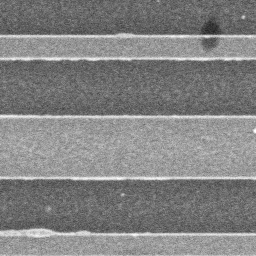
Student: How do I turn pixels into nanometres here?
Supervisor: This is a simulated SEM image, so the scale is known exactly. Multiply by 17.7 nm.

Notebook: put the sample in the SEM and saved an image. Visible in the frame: lines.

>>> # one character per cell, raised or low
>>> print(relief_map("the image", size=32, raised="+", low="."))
................................
................................
................................
................................
..............+++...............
++++++++++++++++++++++++++++++++
++++++++++++++++++++++++++++++++
................................
................................
................................
................................
................................
................................
................................
................................
++++++++++++++++++++++++++++++++
++++++++++++++++++++++++++++++++
++++++++++++++++++++++++++++++++
++++++++++++++++++++++++++++++++
++++++++++++++++++++++++++++++++
++++++++++++++++++++++++++++++++
++++++++++++++++++++++++++++++++
................................
................................
................................
................................
................................
................................
................................
++++++++++++++++++++++++++++++++
++++++++++++++++++++++++++++++++
++++++++++++++++++++++++++++++++